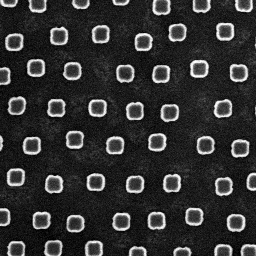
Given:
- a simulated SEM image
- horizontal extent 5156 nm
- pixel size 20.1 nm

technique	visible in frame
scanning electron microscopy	a regular array of raised bodies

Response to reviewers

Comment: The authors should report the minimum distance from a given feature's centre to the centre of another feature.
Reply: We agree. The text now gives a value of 734 nm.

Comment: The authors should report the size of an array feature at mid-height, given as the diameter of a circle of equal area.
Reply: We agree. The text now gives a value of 0.351 micrometres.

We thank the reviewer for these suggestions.